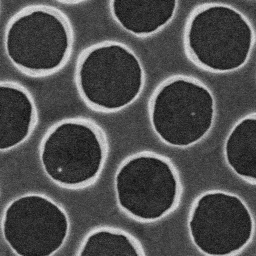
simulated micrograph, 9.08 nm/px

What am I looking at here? holes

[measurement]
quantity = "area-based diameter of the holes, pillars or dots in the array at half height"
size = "581 nm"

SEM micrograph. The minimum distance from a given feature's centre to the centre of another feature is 729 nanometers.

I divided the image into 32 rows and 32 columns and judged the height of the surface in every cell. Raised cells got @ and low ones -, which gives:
@@@@@@@@@@@@@@--------@@@@@@@@@@
@@@----@@@@@@@--------@@@----@@@
@@------@@@@@@@------@@@-------@
@--------@@@@@@@----@@@@-------@
@--------@@@@@@@@@@@@@@--------@
@--------@@@@@@@@@@@@@@--------@
@-------@@@-----@@@@@@@@-------@
@@------@@-------@@@@@@@@------@
@@-----@@@--------@@@@@@@@@--@@@
@@@@@@@@@@--------@@@@@@@@@@@@@@
@@@@@@@@@@--------@@-----@@@@@@@
---@@@@@@@-------@@@------@@@@@@
----@@@@@@@-----@@@--------@@@@@
----@@@@@@@@@-@@@@@--------@@@@@
----@@@@@@@@@@@@@@@-------@@@@@@
----@@@@---@@@@@@@@-------@@@@--
---@@@@-----@@@@@@@@------@@@---
---@@@-------@@@@@@@@----@@@@---
-@@@@--------@@@@@@@@@@@@@@@----
@@@@@--------@@@@--@@@@@@@@@----
@@@@@--------@@------@@@@@@@@---
@@@@@@------@@@-------@@@@@@@@--
@@@@@@@----@@@@-------@@@@@@@@@-
@@@@@@@@@@@@@@@-------@@@@@@@@@@
@@@@@@@@@@@@@@@-------@@@----@@@
@@-----@@@@@@@@-------@@------@@
@-------@@@@@@@@-----@@@-------@
--------@@@@@@@@@@@@@@@@-------@
--------@@@@@@@@@@@@@@@@-------@
@-------@@@-----@@@@@@@@-------@
@-------@@-------@@@@@@@@-----@@
@@-----@@@--------@@@@@@@@---@@@